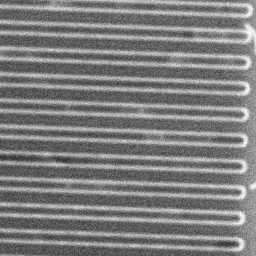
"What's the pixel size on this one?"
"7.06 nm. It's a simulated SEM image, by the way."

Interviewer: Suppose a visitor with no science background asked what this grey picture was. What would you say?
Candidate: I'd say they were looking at groups of lines, slits or small figures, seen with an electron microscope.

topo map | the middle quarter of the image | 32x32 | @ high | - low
--------------------------------
--------------------------------
--------------------------------
@@@@@@@@------------------------
@@@@@@@@@@@@@@@@@@@@@@@@@@@@@@@@
@@@@@@@@@@@@@@@@@@@@@@@@@@@@@@@@
-----------------@@@@@@@@@@@@@@@
--------------------------------
--------------------------------
--------------------------------
@@@@@@@@@@@@@@@@@@@@------------
@@@@@@@@@@@@@@@@@@@@@@@@@@@@@@@@
-----@@@@@@@@@@@@@@@@@@@@@@@@@@@
------------------------------@@
--------------------------------
--------------------------------
@@@@@@@@@-----------------------
@@@@@@@@@@@@@@@@@@@@@@@@@@@@@@@@
@@@@@@@@@@@@@@@@@@@@@@@@@@@@@@@@
------------------@@@@@@@@@@@@@@
--------------------------------
--------------------------------
--------------------------------
@@@@@@@@@@@@@@@@@@@@@-----------
@@@@@@@@@@@@@@@@@@@@@@@@@@@@@@@@
------@@@@@@@@@@@@@@@@@@@@@@@@@@
-------------------------------@
--------------------------------
--------------------------------
@@@@@@@@@-----------------------
@@@@@@@@@@@@@@@@@@@@@@@@@@@@@@@@
@@@@@@@@@@@@@@@@@@@@@@@@@@@@@@@@